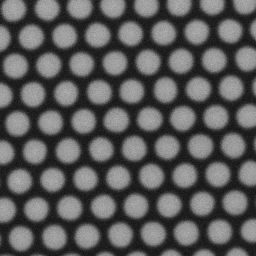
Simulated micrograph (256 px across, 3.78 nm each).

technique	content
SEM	an array of small figures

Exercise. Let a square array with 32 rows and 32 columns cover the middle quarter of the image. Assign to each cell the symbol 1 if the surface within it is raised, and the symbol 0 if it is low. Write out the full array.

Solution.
00111110001111110011111100111111
00111110001111100001111000011110
00011100000011000000110000000000
00000000000000000000000000000000
11000001110000011100000111100001
11100011111000111111000111110001
11100011111100111111000111110001
11100011111100111111000111110001
11100011111000011111000111110000
11100001111000001100000001000000
00000000000000000000000000000000
00001100000011100000111000001111
00011110000111110001111100011111
00111111001111110011111100011111
00111111001111110001111100011111
00111111001111110001111100011111
00011110000011100000111000000110
00000000000000000000000000000000
00000000110000001110000011100000
11100001111000011111000111110001
11110001111100011111000111111001
11110001111100011111000111111001
11110001111100011111000111110000
11100001111000001111000001100000
11000000000000000000000000000000
00000000000000000000111000000111
00011110000111110001111100001111
00011111000111110001111110011111
00011111000111110001111110011111
00011111000111110001111100001111
00011111000111110000111100000111
00000100000000000000000000000000